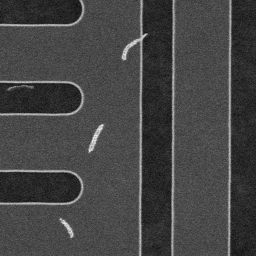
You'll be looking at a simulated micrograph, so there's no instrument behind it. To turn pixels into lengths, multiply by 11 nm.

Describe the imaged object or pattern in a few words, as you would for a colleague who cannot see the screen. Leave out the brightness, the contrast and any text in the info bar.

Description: groups of lines, slits or small figures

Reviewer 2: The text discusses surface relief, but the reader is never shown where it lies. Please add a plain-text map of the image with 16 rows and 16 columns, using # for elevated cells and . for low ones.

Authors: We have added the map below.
.....####..###..
....#####..###..
#########..###..
#########..###..
#########..###..
.....####..###..
.....####..###..
#########..###..
#########..###..
#########..###..
#########..###..
.....####..###..
.....####..###..
#########..###..
#########..###..
#########..###..